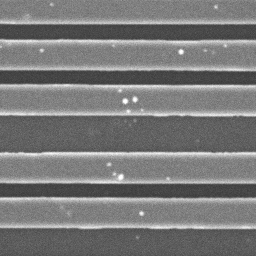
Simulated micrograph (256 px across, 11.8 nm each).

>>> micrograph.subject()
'lines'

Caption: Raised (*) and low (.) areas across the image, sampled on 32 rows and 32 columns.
********************************
********************************
********************************
................................
................................
********************************
********************************
********************************
********************************
................................
................................
********************************
********************************
********************************
................................
................................
................................
................................
................................
********************************
********************************
********************************
********************************
................................
................................
********************************
********************************
********************************
..........**.......**...********
................................
................................
................................